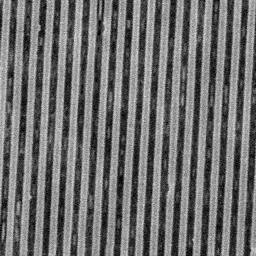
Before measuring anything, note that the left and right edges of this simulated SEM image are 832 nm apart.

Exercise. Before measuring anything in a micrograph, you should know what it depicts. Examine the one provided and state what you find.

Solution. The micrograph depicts parallel lines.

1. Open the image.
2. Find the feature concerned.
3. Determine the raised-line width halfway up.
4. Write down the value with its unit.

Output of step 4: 22.7 nanometers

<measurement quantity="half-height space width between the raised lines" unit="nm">23.1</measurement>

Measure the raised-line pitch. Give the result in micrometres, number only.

0.0468